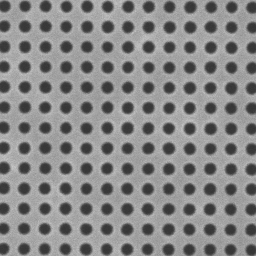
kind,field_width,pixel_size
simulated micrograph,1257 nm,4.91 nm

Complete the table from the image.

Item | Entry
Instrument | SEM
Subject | a regular array of holes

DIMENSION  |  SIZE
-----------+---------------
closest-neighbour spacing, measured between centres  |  20 pixels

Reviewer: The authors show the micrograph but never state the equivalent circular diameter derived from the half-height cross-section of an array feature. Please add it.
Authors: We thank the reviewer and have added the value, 62.9 nanometers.